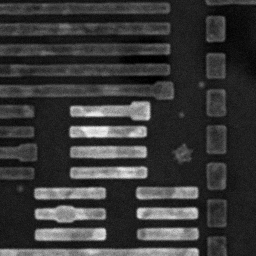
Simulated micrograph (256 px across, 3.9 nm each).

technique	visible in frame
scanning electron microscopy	wiring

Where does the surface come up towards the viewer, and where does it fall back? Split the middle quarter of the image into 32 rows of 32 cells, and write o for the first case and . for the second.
oooooooooooooooooooooooooo......
oooooooooooooooooooooooooo......
oooooooooooooooooooooooooo......
................................
................................
o.oooooooooo...oooooooooooo.....
ooooooooooooooooooooooooooo.....
ooooooooooooooooooooooooooo.....
.......................oooo.....
................................
................ooooo...........
..ooooooooooooooooooo...........
..ooooooooooooooooooo...........
.................oooo...........
................................
................................
..oooooooooooooooooo............
..oooooooooooooooooo............
................................
................................
................................
..oooooooooooooooooo........ooo.
..oooooooooooooooooo........ooo.
............................oooo
................................
................................
..ooooooooooooo..oooo...........
..oooooooooooooo.oooo...........
................................
................................
................................
oooooooooo........oooooooooooooo